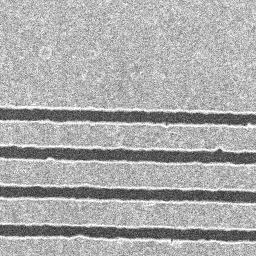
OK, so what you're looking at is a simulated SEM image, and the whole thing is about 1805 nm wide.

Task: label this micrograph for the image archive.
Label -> parallel lines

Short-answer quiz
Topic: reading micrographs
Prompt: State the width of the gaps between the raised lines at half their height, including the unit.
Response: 85.5 nm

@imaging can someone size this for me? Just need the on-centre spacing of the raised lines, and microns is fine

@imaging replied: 0.274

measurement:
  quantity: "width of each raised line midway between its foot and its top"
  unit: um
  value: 0.185